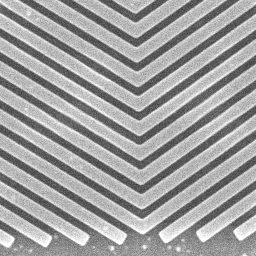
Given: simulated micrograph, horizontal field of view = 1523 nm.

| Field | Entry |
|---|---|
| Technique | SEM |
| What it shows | groups of lines, slits or small figures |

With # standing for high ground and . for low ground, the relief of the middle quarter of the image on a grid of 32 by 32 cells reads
#####.....#####......#####....##
..#####.....#####..######...####
...#####.....##########....#####
.....#####.....#######....#####.
##.....#####....####....#####...
####....######....#....#####....
#####.....#####......#####.....#
..#####....######...#####....###
...######....###########....####
.....#####.....#######....#####.
##.....#####....#####....#####..
###.....######....#....#####....
#####.....#####.......#####....#
..#####....######...#####....###
....####.....###########....####
.....#####.....########...######
##.....####.....#####....#####..
####.....#####....#....#####....
######....#####.......#####....#
..#####.....#####...######...###
...######....###########....####
#....######....########...######
##.....#####.....####....#####..
####....######....##....#####...
######....######......#####....#
..#####.....#####....#####....##
...######....############...####
#....######....########....#####
##.....#####....######...######.
####....######....##....#####...
######....######.......#####....
..#####....######....#####....##